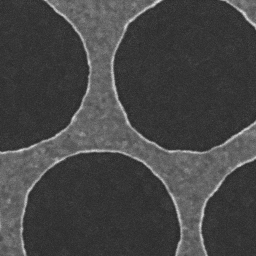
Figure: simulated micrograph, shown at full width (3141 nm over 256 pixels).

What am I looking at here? holes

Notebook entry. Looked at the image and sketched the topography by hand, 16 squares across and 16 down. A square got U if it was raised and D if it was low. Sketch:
DDDUUUUUUDDDDDDU
DDDDUUUUDDDDDDDD
DDDDDUUUDDDDDDDD
DDDDDUUDDDDDDDDD
DDDDDDUDDDDDDDDD
DDDDDUUDDDDDDDDD
DDDDDUUDDDDDDDDD
DDDDDUUUDDDDDDDD
DDDUUUUUUDDDDDDU
UUUUUDDUUUUUDUUU
UUUDDDDDDUUUUUUD
UUDDDDDDDDUUUUDD
UUDDDDDDDDDUUDDD
UDDDDDDDDDDUUDDD
UDDDDDDDDDDUUDDD
UDDDDDDDDDDUUDDD